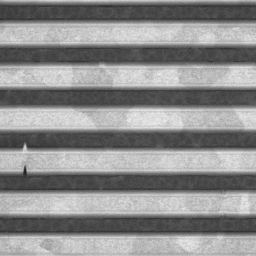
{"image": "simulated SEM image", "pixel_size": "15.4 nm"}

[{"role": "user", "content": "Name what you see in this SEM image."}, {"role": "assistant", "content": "parallel lines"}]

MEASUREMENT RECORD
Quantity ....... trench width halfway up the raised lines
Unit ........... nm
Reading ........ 289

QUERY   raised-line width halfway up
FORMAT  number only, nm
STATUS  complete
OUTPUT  376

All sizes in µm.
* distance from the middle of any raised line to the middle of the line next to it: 0.655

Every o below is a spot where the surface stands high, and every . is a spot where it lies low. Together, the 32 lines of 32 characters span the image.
................................
................................
................................
oooooooooooooooooooooooooooooooo
oooooooooooooooooooooooooooooooo
oooooooooooooooooooooooooooooooo
................................
................................
oooooooooooooooooooooooooooooooo
oooooooooooooooooooooooooooooooo
oooooooooooooooooooooooooooooooo
................................
................................
oooooooooooooooooooooooooooooooo
oooooooooooooooooooooooooooooooo
oooooooooooooooooooooooooooooooo
................................
................................
................................
oooooooooooooooooooooooooooooooo
oooooooooooooooooooooooooooooooo
oooooooooooooooooooooooooooooooo
................................
................................
oooooooooooooooooooooooooooooooo
oooooooooooooooooooooooooooooooo
oooooooooooooooooooooooooooooooo
................................
................................
oooooooooooooooooooooooooooooooo
oooooooooooooooooooooooooooooooo
oooooooooooooooooooooooooooooooo